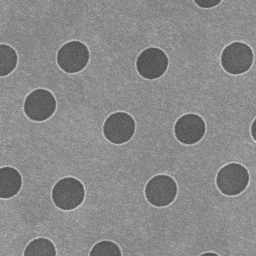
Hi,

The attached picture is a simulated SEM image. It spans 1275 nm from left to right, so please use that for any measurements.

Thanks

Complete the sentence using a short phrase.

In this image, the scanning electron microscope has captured a regular array of holes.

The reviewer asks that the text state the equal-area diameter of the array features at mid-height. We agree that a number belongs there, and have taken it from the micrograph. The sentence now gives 0.164 microns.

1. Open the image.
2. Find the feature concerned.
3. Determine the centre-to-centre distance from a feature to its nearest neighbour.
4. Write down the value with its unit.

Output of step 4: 338 nm